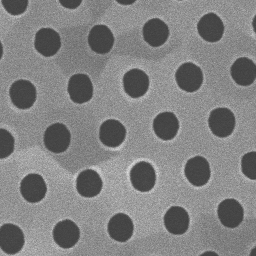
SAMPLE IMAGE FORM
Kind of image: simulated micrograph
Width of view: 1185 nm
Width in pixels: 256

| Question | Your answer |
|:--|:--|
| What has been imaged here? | a regular array of holes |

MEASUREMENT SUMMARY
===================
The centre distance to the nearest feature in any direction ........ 249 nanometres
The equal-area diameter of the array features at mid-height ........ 0.129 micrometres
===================